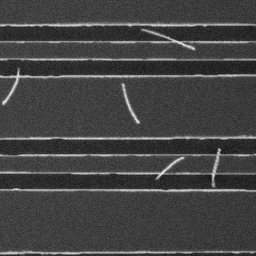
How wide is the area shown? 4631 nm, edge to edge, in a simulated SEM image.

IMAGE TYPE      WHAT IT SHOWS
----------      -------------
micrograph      lines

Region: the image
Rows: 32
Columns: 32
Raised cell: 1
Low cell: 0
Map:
11111111111111111111111111111111
11111111111111111111111111111111
11111111111111111111111111111111
00000000000000000000000000000000
00000000000000000000000000000000
11111111111111111111111111111111
11111111111111111111111111111111
00000000000000000000000000000000
00000000000000000000000000000000
00100000000000000000000010011111
11111111111111111111111111111111
11111111111111111111111111111111
11111111111111111111111111111111
11111111111111111111111111111111
11111111111111111111111111111111
11111111111111111111111111111111
11111111111111111111111111111111
00000000000000000000000000000000
00000000000000000000000000000000
11111111111111111111111111111111
11111111111111111111111111111111
11111111111111111111111111111111
00000000000000000000000000000000
00000000000000000000000000000000
11111111111111111111111111111111
11111111111111111111111111111111
11111111111111111111111111111111
11111111111111111111111111111111
11111111111111111111111111111111
11111111111111111111111111111111
11111111111111111111111111111111
11111111111111111111110100000100